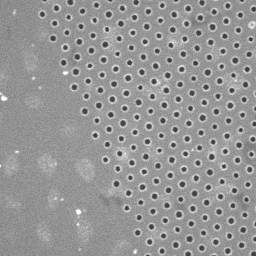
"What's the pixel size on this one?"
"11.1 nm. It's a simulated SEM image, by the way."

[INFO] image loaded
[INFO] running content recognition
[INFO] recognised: a regular array of holes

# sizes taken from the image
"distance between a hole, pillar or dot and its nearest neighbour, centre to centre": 0.166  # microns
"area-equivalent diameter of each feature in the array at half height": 62.7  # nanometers